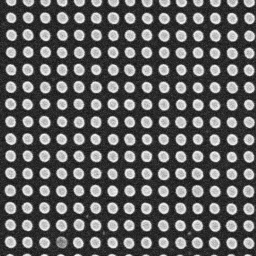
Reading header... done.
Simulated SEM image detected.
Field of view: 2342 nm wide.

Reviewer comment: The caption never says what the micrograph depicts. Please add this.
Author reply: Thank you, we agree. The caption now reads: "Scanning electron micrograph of a regular array of raised bodies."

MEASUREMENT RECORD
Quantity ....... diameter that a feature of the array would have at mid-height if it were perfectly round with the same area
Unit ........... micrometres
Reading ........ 0.0906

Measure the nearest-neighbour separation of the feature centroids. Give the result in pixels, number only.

16.6